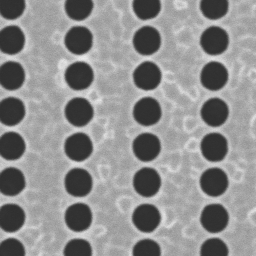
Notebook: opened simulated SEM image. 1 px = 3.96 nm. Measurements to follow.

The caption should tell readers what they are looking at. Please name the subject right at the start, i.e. a regular array of holes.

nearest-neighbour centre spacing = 139 nm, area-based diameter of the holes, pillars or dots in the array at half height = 0.114 microns